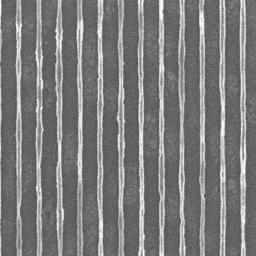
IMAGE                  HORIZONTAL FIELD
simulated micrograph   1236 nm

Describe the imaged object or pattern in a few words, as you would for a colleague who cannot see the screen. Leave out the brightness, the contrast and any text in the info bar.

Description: parallel lines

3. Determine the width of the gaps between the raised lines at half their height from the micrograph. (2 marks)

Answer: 77.3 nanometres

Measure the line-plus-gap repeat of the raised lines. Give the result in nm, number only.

98.5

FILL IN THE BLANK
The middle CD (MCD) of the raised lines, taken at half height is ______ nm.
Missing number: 21.1